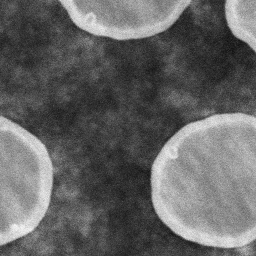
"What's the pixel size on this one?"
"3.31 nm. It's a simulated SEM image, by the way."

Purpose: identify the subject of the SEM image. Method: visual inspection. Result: raised bodies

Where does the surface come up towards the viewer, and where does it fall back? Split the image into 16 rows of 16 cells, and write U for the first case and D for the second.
DDDDUUUUUUUDDDUU
DDDDDUUUUUDDDDDU
DDDDDDDDDDDDDDDD
DDDDDDDDDDDDDDDD
DDDDDDDDDDDDDDDD
DDDDDDDDDDDDDDDD
DDDDDDDDDDDDDDDD
DDDDDDDDDDDDDUUU
UUDDDDDDDDDUUUUU
UUUDDDDDDDUUUUUU
UUUDDDDDDDUUUUUU
UUUDDDDDDDUUUUUU
UUUDDDDDDDUUUUUU
UUDDDDDDDDUUUUUU
UDDDDDDDDDDUUUUU
DDDDDDDDDDDDDDDD